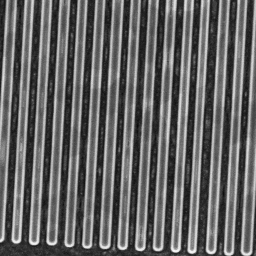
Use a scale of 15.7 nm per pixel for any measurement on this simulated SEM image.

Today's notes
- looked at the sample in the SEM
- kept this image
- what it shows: parallel lines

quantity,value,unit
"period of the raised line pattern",278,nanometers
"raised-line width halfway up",121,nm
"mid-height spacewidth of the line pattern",0.151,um